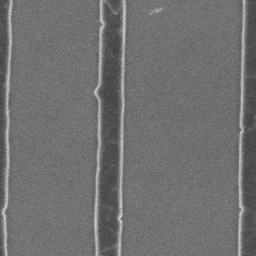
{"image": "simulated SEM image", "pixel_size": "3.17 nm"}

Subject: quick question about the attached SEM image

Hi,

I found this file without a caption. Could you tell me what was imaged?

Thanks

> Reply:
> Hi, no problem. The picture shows one or a few lines or trenches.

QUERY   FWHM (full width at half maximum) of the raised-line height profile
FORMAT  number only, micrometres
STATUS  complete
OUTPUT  0.0788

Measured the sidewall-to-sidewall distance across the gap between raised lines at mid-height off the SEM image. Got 330 nanometers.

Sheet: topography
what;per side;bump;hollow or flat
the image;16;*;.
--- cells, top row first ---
*.....**.......*
*.....**.......*
*.....**.......*
*.....**.......*
*.....**.......*
*.....**.......*
......**.......*
*.....**.......*
......**.......*
*.....**.......*
*.....**.......*
......**.......*
......**.......*
......**.......*
......**.......*
......**.......*